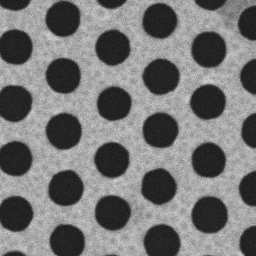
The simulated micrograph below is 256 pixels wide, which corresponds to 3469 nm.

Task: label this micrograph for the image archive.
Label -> a regular array of holes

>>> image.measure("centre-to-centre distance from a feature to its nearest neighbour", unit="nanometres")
722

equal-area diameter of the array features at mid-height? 488 nm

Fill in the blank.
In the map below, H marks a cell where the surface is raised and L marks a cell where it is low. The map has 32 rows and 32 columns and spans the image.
LLLLHHHLLHHHHLLHHHHLLHHHHLLLHHHH
HHHHHHLLLLHHHHHHHHLLLLHHHHHHHHLL
HHHHHHLLLLHHHHHHHHLLLLHHHHHHHHLL
HHHHHHLLLLHHHHHHHHLLLLHHHHHHHHLL
LLLLHHHLLHHHLLLLHHHLLHHHHLLLHHLL
LLLLHHHHHHHHLLLLHHHHHHHHLLLLHHHH
LLLLHHHHHHHHLLLLHHHHHHHHLLLLHHHH
LLLHHHHLLHHHHLLLHHHLLHHHLLLLHHHL
HHHHHHLLLLHHHHHHHHLLLLHHHHHHHHLL
HHHHHHLLLLHHHHHHHHLLLLHHHHHHHHLL
HHHHHHLLLLHHHHHHHHLLLLHHHHHHHHLL
LLLLHHHLLHHHHLLLHHHLLHHHLLLLHHHL
LLLLHHHHHHHHLLLLHHHHHHHHLLLLHHHH
LLLLHHHHHHHHLLLLHHHHHHHHLLLLHHHH
LLLHHHHLLHHHHLLLHHHLLHHHHLLHHHHL
HHHHHHLLLLHHHHHHHHLLLLHHHHHHHHLL
HHHHHHLLLLHHHHHHHHLLLLHHHHHHHHLL
HHHHHHLLLLHHHHHHHHLLLLHHHHHHHHLL
LLLLHHHLLHHHLLLLHHHHLHHHHLLLHHHH
LLLLHHHHHHHHLLLLHHHHHHHHLLLLHHHH
LLLLHHHHHHHHLLLLHHHHHHHHLLLLHHHH
LLLHHHHLLHHHLLLLHHLLLHHHLLLLHHHL
HHHHHHLLLLHHHHHHHHLLLLHHHHHHHHLL
HHHHHHLLLLHHHHHHHHLLLLHHHHHHHHLL
HHHHHHLLLLHHHLLHHHLLLLHHHHHHHHLL
LLLLHHHLLHHHLLLLHHHLHHHHLLLLHHHL
LLLLHHHHHHHHLLLLHHHHHHHHLLLLHHHH
LLLLHHHHHHHHLLLLHHHHHHHHLLLLHHHH
HLLHHHHLLLHHHLLHHHHLLLHHLLLLHHHL
HHHHHHLLLLLHHHHHHHLLLLHHHHHHHHLL
HHHHHHLLLLLHHHHHHHLLLLLHHHHHHHLL
HLLHHHHLLLHHHHHHHHLLLLHHHHHHHHLL